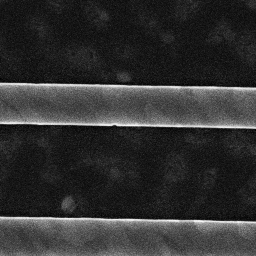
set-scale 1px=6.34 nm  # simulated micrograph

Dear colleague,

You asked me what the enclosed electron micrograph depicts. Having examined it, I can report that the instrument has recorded one or a few lines or trenches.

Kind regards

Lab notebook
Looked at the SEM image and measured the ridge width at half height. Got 255 nanometres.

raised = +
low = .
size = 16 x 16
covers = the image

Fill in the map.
................
................
................
................
................
++++++++++++++..
++++++++++++++++
++++++++++++++++
................
................
................
................
................
................
++++++++++++++++
++++++++++++++++